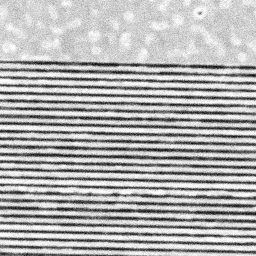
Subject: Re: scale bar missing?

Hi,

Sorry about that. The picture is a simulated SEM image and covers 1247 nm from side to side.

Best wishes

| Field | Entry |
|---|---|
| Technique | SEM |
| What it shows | parallel lines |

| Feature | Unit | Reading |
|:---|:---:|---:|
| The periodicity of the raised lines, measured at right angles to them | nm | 37.3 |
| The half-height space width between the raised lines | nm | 21.3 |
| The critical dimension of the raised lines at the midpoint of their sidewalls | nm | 17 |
